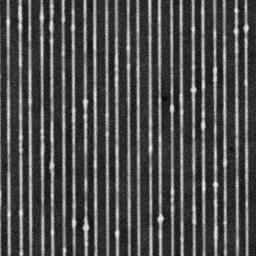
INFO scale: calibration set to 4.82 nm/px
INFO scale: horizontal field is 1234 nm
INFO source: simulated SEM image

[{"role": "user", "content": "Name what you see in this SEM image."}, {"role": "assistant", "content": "parallel lines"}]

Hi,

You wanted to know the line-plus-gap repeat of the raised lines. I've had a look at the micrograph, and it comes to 52.1 nanometres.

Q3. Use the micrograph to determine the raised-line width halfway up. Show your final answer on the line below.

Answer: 8.4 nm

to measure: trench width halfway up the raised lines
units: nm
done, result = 38